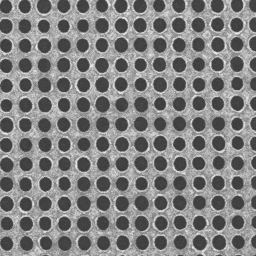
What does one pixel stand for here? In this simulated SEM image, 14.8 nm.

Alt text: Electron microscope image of a regular array of holes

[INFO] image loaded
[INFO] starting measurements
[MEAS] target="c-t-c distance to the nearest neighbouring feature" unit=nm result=283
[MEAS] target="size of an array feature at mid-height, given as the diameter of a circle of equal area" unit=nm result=208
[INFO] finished